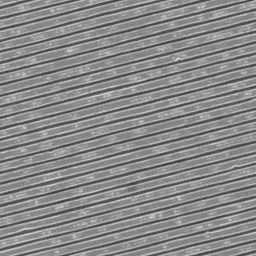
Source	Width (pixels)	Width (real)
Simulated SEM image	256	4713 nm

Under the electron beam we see parallel lines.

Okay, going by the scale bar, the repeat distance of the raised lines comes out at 10.7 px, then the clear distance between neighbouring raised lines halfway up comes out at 0.0647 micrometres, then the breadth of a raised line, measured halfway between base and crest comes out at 0.132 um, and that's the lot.